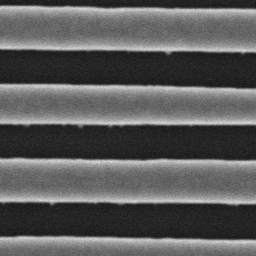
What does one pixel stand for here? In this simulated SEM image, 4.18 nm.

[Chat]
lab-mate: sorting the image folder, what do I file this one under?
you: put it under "lines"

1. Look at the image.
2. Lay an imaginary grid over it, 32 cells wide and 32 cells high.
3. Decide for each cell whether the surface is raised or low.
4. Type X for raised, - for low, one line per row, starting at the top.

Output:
--------------------------------
XXXXXXXXXXXXXXXXXXXXXXXXXXXXXXXX
XXXXXXXXXXXXXXXXXXXXXXXXXXXXXXXX
XXXXXXXXXXXXXXXXXXXXXXXXXXXXXXXX
XXXXXXXXXXXXXXXXXXXXXXXXXXXXXXXX
XXXXXXXXXXXXXXXXXXXXXXXXXXXXXXXX
--------------------------------
--------------------------------
--------------------------------
--------------------------------
--------------------------------
XXXXXXXXXXXXXXXXXXXXXXXXXXXXXXXX
XXXXXXXXXXXXXXXXXXXXXXXXXXXXXXXX
XXXXXXXXXXXXXXXXXXXXXXXXXXXXXXXX
XXXXXXXXXXXXXXXXXXXXXXXXXXXXXXXX
----------XXXXXXXXXXXXXXXXXXXXXX
--------------------------------
--------------------------------
--------------------------------
--------------------------------
XXXXXXXXXXXXXXXXXXXXXXXXXXXXXXXX
XXXXXXXXXXXXXXXXXXXXXXXXXXXXXXXX
XXXXXXXXXXXXXXXXXXXXXXXXXXXXXXXX
XXXXXXXXXXXXXXXXXXXXXXXXXXXXXXXX
XXXXXXXXXXXXXXXXXXXXXXXXXXXXXXXX
--------------------------------
--------------------------------
--------------------------------
--------------------------------
--------------------------------
XXXXXXXXXXXXXXXXXXXXXXXXXXXXXXXX
XXXXXXXXXXXXXXXXXXXXXXXXXXXXXXXX